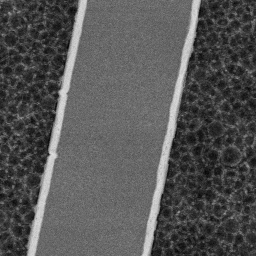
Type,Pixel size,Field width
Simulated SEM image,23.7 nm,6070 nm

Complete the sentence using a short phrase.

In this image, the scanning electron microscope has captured one or a few lines or trenches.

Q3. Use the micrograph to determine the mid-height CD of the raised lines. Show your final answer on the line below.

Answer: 2630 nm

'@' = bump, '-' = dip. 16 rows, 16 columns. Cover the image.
-----@@@@@@@----
-----@@@@@@@----
-----@@@@@@@----
----@@@@@@@@----
----@@@@@@@-----
----@@@@@@@-----
----@@@@@@@-----
----@@@@@@@-----
---@@@@@@@@-----
---@@@@@@@------
---@@@@@@@------
---@@@@@@@------
---@@@@@@@------
--@@@@@@@@------
--@@@@@@@-------
--@@@@@@@-------